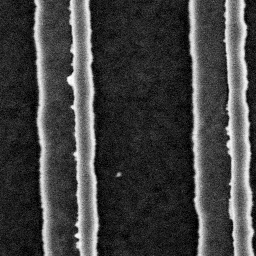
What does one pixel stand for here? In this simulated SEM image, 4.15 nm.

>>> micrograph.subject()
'lines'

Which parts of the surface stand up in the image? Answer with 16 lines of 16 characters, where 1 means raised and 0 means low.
0011110000001110
0011110000001110
0011110000001110
0011110000001110
0011110000001110
0001110000001110
0001110000001110
0011110000001110
0001110000001110
0001110000001111
0001110000001110
0001110000001111
0001110000001111
0001110000001111
0001110000000111
0001110000000111